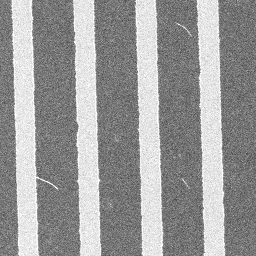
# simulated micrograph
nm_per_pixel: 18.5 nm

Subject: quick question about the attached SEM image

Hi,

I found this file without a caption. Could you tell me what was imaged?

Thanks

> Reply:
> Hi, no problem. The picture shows one or a few lines or trenches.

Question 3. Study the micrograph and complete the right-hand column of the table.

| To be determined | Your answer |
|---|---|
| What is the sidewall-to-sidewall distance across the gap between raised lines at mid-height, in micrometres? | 0.786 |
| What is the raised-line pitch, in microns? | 1.15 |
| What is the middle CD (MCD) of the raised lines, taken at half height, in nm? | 358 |